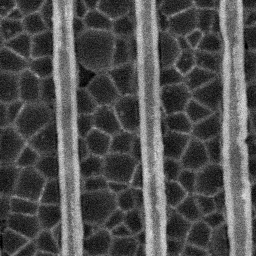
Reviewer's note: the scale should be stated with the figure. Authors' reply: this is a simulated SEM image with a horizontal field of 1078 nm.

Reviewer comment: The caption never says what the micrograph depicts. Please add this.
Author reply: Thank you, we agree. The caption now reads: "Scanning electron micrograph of one or a few lines or trenches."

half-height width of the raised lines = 70.4 nm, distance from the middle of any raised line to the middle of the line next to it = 0.353 µm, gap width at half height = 281 nm